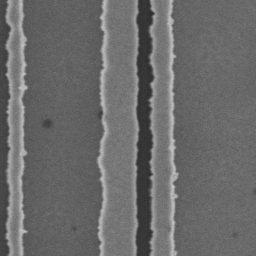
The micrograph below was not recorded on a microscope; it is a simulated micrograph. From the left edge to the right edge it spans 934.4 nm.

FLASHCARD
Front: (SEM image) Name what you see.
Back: lines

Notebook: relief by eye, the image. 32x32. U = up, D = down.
DUUDDDDDDDDDDUUUUDDUUDDDDDDDDDDD
DUUDDDDDDDDDDUUUUDDUUDDDDDDDDDDD
DUUDDDDDDDDDDUUUUDDUUUDDDDDDDDDD
DUUDDDDDDDDDDUUUUDDUUDDDDDDDDDDD
DUUDDDDDDDDDDUUUUDDUUUDDDDDDDDDD
DUUDDDDDDDDDDUUUUDDUUUDDDDDDDDDD
DUUDDDDDDDDDDUUUUDDUUUDDDDDDDDDD
DUUDDDDDDDDDDUUUUDDUUUDDDDDDDDDD
DUUDDDDDDDDDDUUUUDDUUDDDDDDDDDDD
DUUDDDDDDDDDDUUUUDDUUUDDDDDDDDDD
DUUDDDDDDDDDDUUUUDDUUDDDDDDDDDDD
DUUDDDDDDDDDDUUUUDDUUUDDDDDDDDDD
DUUDDDDDDDDDDUUUUDDUUUDDDDDDDDDD
DUUDDDDDDDDDDUUUUDDUUUDDDDDDDDDD
DUUDDDDDDDDDDUUUUDDUUUDDDDDDDDDD
DUUDDDDDDDDDDUUUUDDUUUDDDDDDDDDD
DUUDDDDDDDDDDUUUUDDUUUDDDDDDDDDD
DUUDDDDDDDDDDUUUUDDUUUDDDDDDDDDD
DUUDDDDDDDDDDUUUUDDUUUDDDDDDDDDD
DUUDDDDDDDDDDUUUUDDUUUDDDDDDDDDD
DUUDDDDDDDDDUUUUUDDUUUDDDDDDDDDD
DUUDDDDDDDDDDUUUUDDUUUDDDDDDDDDD
DUUDDDDDDDDDDUUUUDDUUUDDDDDDDDDD
DUUDDDDDDDDDDUUUUDDUUUDDDDDDDDDD
DUUDDDDDDDDDDUUUUDDUUUDDDDDDDDDD
DUUDDDDDDDDDDUUUUDDUUUDDDDDDDDDD
DUUDDDDDDDDDDUUUUDDUUUDDDDDDDDDD
DUUDDDDDDDDDDUUUUDDUUUDDDDDDDDDD
DUUDDDDDDDDDUUUUUDDUUUDDDDDDDDDD
DUUDDDDDDDDDUUUUUDDUUUDDDDDDDDDD
DUUDDDDDDDDDDUUUUDDUUUDDDDDDDDDD
DUUDDDDDDDDDDUUUUDDUUUDDDDDDDDDD